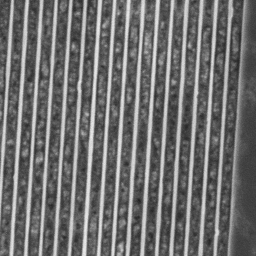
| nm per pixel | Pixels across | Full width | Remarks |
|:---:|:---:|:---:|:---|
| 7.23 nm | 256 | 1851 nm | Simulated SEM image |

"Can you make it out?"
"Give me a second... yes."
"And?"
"parallel lines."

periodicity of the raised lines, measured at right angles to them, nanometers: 105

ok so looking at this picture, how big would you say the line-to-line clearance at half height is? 11.6 px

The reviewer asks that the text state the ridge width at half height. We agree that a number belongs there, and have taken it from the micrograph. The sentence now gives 19.8 nm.